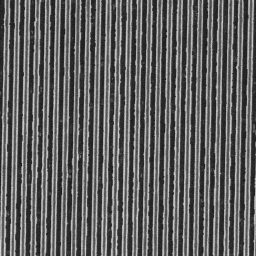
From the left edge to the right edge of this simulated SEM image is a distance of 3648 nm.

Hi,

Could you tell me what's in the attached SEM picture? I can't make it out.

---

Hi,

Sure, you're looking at parallel lines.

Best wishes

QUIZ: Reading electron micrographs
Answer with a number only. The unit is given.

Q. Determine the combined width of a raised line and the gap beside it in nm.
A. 145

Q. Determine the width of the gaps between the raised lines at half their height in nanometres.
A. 76.6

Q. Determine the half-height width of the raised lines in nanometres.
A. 64.1